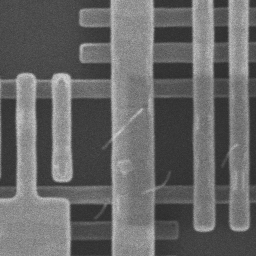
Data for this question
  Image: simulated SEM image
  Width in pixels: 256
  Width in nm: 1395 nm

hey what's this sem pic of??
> wiring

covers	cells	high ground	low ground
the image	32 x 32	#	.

..............#####.....###..##.
..............#####.....###..##.
..............#####.....###..##.
..............#####.....###..##.
..............#####.....###..##.
..............#####.....###..##.
..............#####.....###..##.
..............#####.....###..##.
..............#####.....###..##.
..##...##.....#####.....###..##.
..##..###.....#####.....###..##.
..##..###.....#####.....###..##.
..##...##.....#####.....###..##.
..##...##.....#####.....###..##.
..##...##.....#####.....###..##.
..##...##.....#####.....###..##.
..##...##.....#####.....###..##.
..##...##.....#####.....###..##.
..##...##.....#####.....###..##.
..##...##.....#####.....###..##.
..##...##.....#####.....###..##.
..##...##.....#####.....###..##.
..##...##.....#####.....###..##.
..##..........#####.....###..##.
..###.........#####.....###..##.
#########.....#####.....###..##.
#########.....#####.....###..##.
#########.....#####.....###..##.
#########.....#####.....###..##.
#########.....#####.............
#########.....#####.............
#########.....#####.............